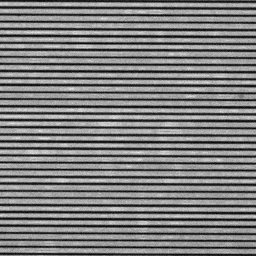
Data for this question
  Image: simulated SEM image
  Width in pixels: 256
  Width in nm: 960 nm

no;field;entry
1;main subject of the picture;parallel lines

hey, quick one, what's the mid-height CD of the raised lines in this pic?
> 19.2 nm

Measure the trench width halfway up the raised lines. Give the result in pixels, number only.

2.51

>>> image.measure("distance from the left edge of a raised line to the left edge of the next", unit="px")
7.04